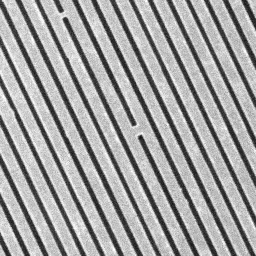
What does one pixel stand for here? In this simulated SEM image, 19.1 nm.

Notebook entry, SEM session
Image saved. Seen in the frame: parallel lines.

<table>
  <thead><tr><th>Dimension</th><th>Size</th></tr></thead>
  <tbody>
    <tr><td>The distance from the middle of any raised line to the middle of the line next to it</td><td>0.324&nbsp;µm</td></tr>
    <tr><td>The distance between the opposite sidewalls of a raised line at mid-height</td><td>204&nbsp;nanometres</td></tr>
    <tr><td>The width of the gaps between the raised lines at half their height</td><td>118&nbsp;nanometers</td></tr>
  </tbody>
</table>